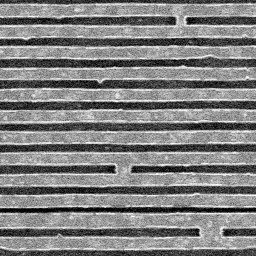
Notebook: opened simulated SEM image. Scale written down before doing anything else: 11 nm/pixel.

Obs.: parallel lines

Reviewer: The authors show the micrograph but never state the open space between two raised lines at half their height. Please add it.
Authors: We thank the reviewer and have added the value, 95.1 nm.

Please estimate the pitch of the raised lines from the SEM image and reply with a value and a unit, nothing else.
233 nm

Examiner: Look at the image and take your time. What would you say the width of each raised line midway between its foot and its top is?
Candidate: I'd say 138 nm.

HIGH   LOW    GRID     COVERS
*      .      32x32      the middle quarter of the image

................................
********************************
********************************
********************************
................................
................................
*******************............*
********************************
********************************
................................
................................
......*......**.................
********************************
********************************
................................
................................
................................
********************************
********************************
********************************
................................
................................
********************************
********************************
********************************
.............****...............
.............****...............
....*........****.....**********
********************************
********************************
************....................
................................